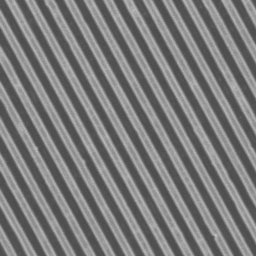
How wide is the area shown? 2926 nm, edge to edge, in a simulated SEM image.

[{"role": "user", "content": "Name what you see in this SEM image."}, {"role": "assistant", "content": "parallel lines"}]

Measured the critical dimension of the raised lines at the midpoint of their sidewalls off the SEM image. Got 90.2 nm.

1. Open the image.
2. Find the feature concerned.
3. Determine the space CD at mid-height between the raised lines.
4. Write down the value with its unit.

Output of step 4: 100 nanometers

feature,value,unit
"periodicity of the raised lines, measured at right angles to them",0.197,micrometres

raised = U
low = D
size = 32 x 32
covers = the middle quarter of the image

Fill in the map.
UUDDUUUDDUUDDDUUDDDUUDDDUUDDDUUD
UUDDDUUDDDUUDDUUUDDUUUDDUUUDDUUU
UUUDDUUDDDUUDDDUUDDDUUDDDUUDDDUU
DUUDDDUUDDDUUDDDUUDDDUUDDDUUDDUU
DDUUDDUUDDDUUDDDUUDDDUUDDDUUDDDU
DDUUDDDUUDDDUUDDDUUDDDUUDDDUUDDU
DDDUUDDUUUDDUUUDDUUUDDUUDDDUUDDD
DDDUUDDDUUDDDUUDDDUUDDDUUDDDUUDD
UDDDUUDDDUUDDDUUDDUUUDDUUDDDUUDD
UUDDUUDDDUUDDDUUDDDUUDDDUUDDDUUD
UUDDDUUDDDUUDDDUUDDUUUDDUUUDDUUD
UUUDDUUUDDUUDDDUUDDDUUDDDUUDDDUU
DUUDDDUUDDDUUDDDUUDDDUUDDUUUDDUU
DUUUDDUUUDDUUDDDUUDDDUUDDDUUDDDU
DDUUDDDUUDDDUUDDDUUDDDUUDDDUUDDD
DDDUUDDDUUDDUUDDDUUDDDUUDDDUUDDD
UDDUUDDDUUDDDUUDDDUUDDDUUDDDUUDD
UDDDUUDDDUUDDUUUDDDUUDDUUUDDUUUD
UUDDUUDDDUUDDDUUDDDUUDDDUUDDDUUD
UUDDDUUDDDUUDDDUUDDDUUDDDUDDDUUU
UUUDDUUDDDUUDDDUUDDDUUDDDUUDDDUU
DUUDDDUUDDDUUDDDUUDDDUUDDDUUDDUU
DUUUDDUUUDDUUUDDUUDDDUUDDDUUDDDU
DDUUDDDUUDDDUUDDDUUDDDUUDDDUUDDU
DDDUUDDDUUDDDUUDDUUDDDUUDDDUUDDD
DDDUUDDDUUDDDUUDDDUUDDDUUDDDUUDD
UDDDUUDDDUUDDDUUDDUUUDDUUDDDUUDD
UUDDUUUDDUUDDDUUDDDUUDDDUUDDDUUD
UUDDDUUDDDUUDDDUUDDUUUDDUUUDDUUU
DUUDDUUUDDUUDDDUUDDDUUDDDUUDDDUU
DUUDDDUUDDDUUDDDUUDDDUUDDDUUDDDU
DDUUDDUUUDDUUDDDUUDDDUUDDDUUDDDU